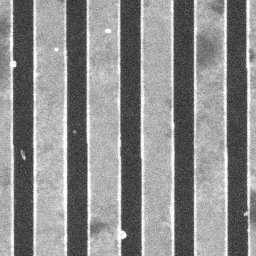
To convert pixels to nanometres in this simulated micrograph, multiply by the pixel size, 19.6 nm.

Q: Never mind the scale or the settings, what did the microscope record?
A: lines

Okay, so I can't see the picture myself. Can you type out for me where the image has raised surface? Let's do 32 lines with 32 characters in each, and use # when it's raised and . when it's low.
##..####...####...###...####...#
##..####...####...####..####...#
##..####...####...####..####...#
##..####...####...####..####...#
##..####...####...####..####...#
##..####...####...####..####...#
##..####...####...####..####...#
##..####...####...####..####...#
##..####...####...####..####...#
##..####...####...####..####...#
##..####...####...####..####...#
##..####...####...####..####...#
##..####...####...####..####...#
##..####...####...####..####...#
##..####...####...####..####...#
##..####...####...####..####...#
##..####...####...####..####...#
##..####...####...####..####...#
##..####...####...####..####...#
##..####...####...####..####...#
##..####...####...####..####...#
##..####...####...####..####...#
##..####...####...####..####...#
##..####...####...####..####...#
##..####...####...####..####...#
##..####...####...####..####...#
##..####...####...####..####...#
##..####...####...####..####...#
##..####...####...####..####...#
##..####...####...####..####...#
##..####...####...####..####...#
##..####...####...####..####...#